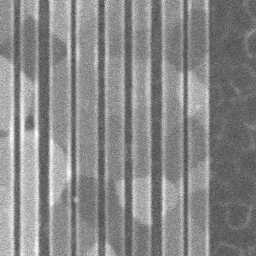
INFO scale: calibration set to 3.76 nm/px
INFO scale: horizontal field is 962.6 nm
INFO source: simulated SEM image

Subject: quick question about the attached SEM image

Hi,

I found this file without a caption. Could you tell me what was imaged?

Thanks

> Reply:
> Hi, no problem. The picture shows parallel lines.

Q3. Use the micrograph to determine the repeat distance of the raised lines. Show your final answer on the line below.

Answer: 106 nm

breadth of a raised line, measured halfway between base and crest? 78 nm